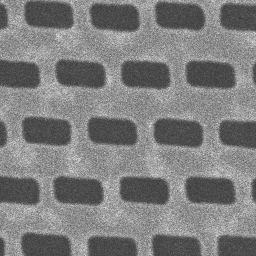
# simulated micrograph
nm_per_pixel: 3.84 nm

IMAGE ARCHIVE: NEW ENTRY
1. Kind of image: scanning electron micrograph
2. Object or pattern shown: a regular array of holes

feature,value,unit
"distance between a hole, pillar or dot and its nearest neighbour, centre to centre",252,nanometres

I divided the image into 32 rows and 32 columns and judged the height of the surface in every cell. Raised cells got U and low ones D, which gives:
UUUDDDDDUUUUDDDDUUUUDDDDUUUUDDDU
DUUDDDDDDUUDDDDDDUUDDDDDDUUUDDDD
DUUDDDDDDUUDDDDDDUUDDDDDDDUUDDDD
DUUUUDDDDUUUDDDDDUUUDDDDDUUUDDDD
UUUUUUUUUUUUUUUUUUUUUUUUUUUUUUUU
UUUUUUUUUUUUUUUUUUUUUUUUUUUUUUUU
UUUUUUUUUUUUUUUUUUUUUUUUUUUUUUUU
UUUUUUUDDDUUUUUUUUUUUUUUUUUUUUUU
DDDDDUUDDDDDDUUDDDDDDUUDDDDDDUUU
DDDDDUUDDDDDDUUDDDDDDUUDDDDDDUUU
DDDDDUUUDDDDDUUDDDDDDUUUDDDDDUUU
UUUUUUUUUUUUUUUUUUUUUUUUUUUUUUUU
UUUUUUUUUUUUUUUUUUUUUUUUUUUUUUUU
UUUUUUUUUUUUUUUUUUUUUUUUUUUUUUUU
UUUUDUUUUUUUUUUUUUUUUUUUUUUUUUUU
DUUDDDDDDUUDDDDDDUUDDDDDDUUUDDDD
DUUDDDDDDUUDDDDDDUUDDDDDDUUDDDDD
DUUDDDDDDUUDDDDDDUUDDDDDDUUUDDDD
UUUUUUUUUUUUUUUUUUUUUUUUUUUUUUDD
UUUUUUUUUUUUUUUUUUUUUUUUUUUUUUUU
UUUUUUUUUUUUUUUUUUUUUUUUUUUUUUUU
UUUUUUUUUUUUUUUUUUUUUUUUUUUUUUUU
DDDDUUUDDDDDUUUDDDDDDUUDDDDDDUUU
DDDDDUUDDDDDDUUDDDDDDUUDDDDDDUUD
DDDDDUUDDDDDDUUDDDDDDUUDDDDDDUUD
UUDDUUUUDDDDDUUUUUUDUUUUUDUDDUUU
UUUUUUUUUUUUUUUUUUUUUUUUUUUUUUUU
UUUUUUUUUUUUUUUUUUUUUUUUUUUUUUUU
UUUUUUUUUUUUUUUUUUUUUUUUUUUUUUUU
UUUDDDDDUUUUDUUUUUUDDDDUUUUUDDDU
DUUDDDDDDUUDDDDDDUUDDDDDDUUDDDDD
DUUDDDDDDUUDDDDDDUUDDDDDDUUDDDDD